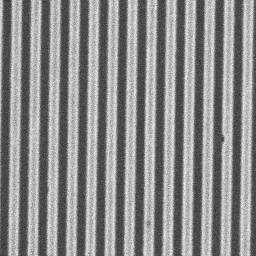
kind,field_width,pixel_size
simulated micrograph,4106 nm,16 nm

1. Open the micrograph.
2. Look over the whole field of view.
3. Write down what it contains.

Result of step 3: parallel lines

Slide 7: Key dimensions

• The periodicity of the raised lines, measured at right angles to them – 310 nanometers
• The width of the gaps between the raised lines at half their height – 9.5 px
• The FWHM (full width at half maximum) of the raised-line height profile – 0.152 µm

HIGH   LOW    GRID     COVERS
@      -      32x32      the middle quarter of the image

-@@@--@@---@@---@@---@@---@@--@@
-@@---@@---@@---@@---@@---@@--@@
-@@---@@---@@---@@---@@---@@--@@
-@@---@@---@@---@@---@@---@@--@@
-@@---@@---@@---@@---@@---@@--@@
-@@---@@---@@---@@---@@--@@@--@@
-@@---@@---@@---@@--@@@--@@@--@@
-@@---@@---@@---@@--@@@--@@@--@@
-@@---@@---@@---@@--@@@--@@@--@@
-@@---@@---@@---@@--@@@--@@@--@@
-@@---@@---@@---@@--@@@--@@@--@@
-@@---@@---@@---@@--@@@--@@@--@@
-@@---@@---@@---@@--@@@--@@@--@@
-@@---@@---@@---@@--@@@--@@@--@@
-@@---@@---@@---@@--@@@--@@---@@
-@@---@@---@@---@@--@@@--@@---@@
-@@---@@---@@---@@--@@@--@@---@@
-@@---@@---@@---@@--@@@--@@---@@
-@@---@@---@@---@@--@@@--@@---@@
-@@---@@---@@---@@--@@@--@@---@@
-@@---@@---@@---@@--@@@--@@---@@
-@@---@@---@@---@@--@@@--@@---@@
-@@---@@---@@---@@--@@@--@@---@@
-@@---@@---@@---@@--@@@--@@---@@
-@@---@@---@@--@@@--@@@--@@---@@
-@@---@@---@@--@@@--@@@--@@---@@
-@@---@@---@@--@@@--@@@--@@---@@
-@@---@@---@@--@@@--@@@--@@---@@
-@@---@@---@@--@@@--@@@--@@---@@
-@@---@@---@@--@@@--@@@--@@---@@
-@@---@@---@@--@@@--@@@--@@---@@
-@@---@@---@@--@@@--@@@--@@---@@